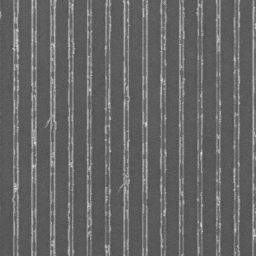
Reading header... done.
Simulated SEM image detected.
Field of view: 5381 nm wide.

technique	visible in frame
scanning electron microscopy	parallel lines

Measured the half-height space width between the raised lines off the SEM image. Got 0.302 um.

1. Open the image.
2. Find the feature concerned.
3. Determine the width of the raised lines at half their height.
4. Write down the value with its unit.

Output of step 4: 94.6 nm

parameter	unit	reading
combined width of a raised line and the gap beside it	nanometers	387